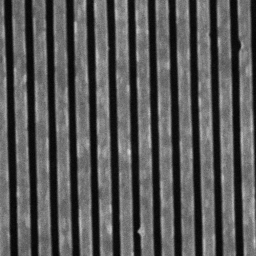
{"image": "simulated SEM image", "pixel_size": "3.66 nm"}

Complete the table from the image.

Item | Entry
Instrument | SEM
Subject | parallel lines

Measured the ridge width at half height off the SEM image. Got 44.4 nm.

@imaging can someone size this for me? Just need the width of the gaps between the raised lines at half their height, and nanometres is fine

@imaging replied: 30.7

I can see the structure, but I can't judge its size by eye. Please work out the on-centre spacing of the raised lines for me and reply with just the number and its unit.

75.1 nm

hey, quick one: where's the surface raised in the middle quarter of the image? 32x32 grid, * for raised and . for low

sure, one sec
*..***..***..***..***..***..***.
*..***..***..***..***..***..***.
*..***..***..***..***...**...**.
*..***..***..***..***...**...**.
*..***..***..***..***...**...**.
*..***..***..***..***...**...**.
*..***..***..***..***...**...**.
*..***..***..***..***...**...**.
*..***..***..***...**...**...**.
*..***..***..***...**...**...**.
*..***..***...**...**...**...***
*..***..***...**...**...**...***
*..***..***...**...**...**...***
*..***..***...**...**...**...***
*..***..***...**...**...**...***
*..***..***...**...**...***..***
*..***..***...**...**...***..***
*..***..***...**...**...***..***
*..***..***...**...**...***..***
*..***..***...**...**...***..***
*..***..***...**...***..***..***
*..***...**...**...***..***..***
*..***...**...**...***..***..***
*..***...**...**...***..***..***
*..***...**...**...***..***..***
*..****..**...***..***..***..***
*...***..**...***..***..***..***
*...***..**...***..***..***..***
*...**...**...***..***..***..***
*...**...**...***..***..***..***
*...**...***..***..***..***..***
*...***..***..***..***..***..***